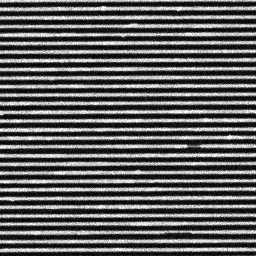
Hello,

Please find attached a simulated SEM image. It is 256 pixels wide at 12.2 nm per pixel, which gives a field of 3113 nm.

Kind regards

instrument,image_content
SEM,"parallel lines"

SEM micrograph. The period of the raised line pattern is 8.61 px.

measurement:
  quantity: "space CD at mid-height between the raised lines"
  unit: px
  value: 5.87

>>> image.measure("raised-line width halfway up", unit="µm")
0.0365